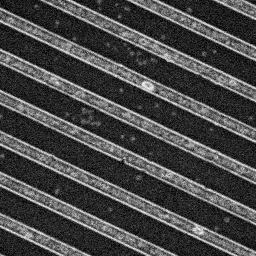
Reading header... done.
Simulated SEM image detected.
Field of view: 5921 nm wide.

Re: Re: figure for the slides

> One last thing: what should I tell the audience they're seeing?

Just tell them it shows parallel lines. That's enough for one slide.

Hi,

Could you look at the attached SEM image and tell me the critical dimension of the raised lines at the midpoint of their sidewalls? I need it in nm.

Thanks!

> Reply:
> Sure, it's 264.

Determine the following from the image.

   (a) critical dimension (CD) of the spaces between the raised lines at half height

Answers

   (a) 0.593 um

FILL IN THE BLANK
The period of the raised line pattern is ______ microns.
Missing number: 0.859